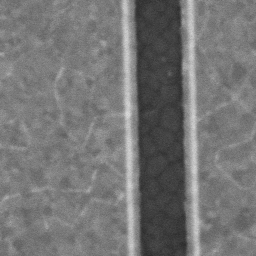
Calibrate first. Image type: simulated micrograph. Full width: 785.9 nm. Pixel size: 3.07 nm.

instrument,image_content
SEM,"one or a few lines or trenches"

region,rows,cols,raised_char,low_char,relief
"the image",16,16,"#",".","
########....####
########....####
########....####
########....####
########....####
########....####
########....####
########....####
########....####
########....####
########....####
########....####
########....####
########....####
########....####
########....####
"